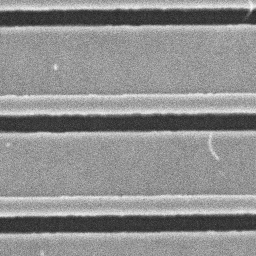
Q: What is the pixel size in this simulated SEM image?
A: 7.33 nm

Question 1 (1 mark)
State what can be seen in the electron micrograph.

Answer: lines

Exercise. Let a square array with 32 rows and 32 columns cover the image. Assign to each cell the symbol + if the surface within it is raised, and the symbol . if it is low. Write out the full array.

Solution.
++++++++++++++++++++++++++++++++
................................
................................
++++++++++++++++++++++++++++++++
++++++++++++++++++++++++++++++++
++++++++++++++++++++++++++++++++
++++++++++++++++++++++++++++++++
++++++++++++++++++++++++++++++++
++++++++++++++++++++++++++++++++
++++++++++++++++++++++++++++++++
++++++++++++++++++++++++++++++++
++++++++++++++++++++++++++++++++
++++++++++++++++++++++++++++++++
++++++++++++++++++++++++++++++++
................................
................................
..................++++++++++++++
++++++++++++++++++++++++++++++++
++++++++++++++++++++++++++++++++
++++++++++++++++++++++++++++++++
++++++++++++++++++++++++++++++++
++++++++++++++++++++++++++++++++
++++++++++++++++++++++++++++++++
++++++++++++++++++++++++++++++++
++++++++++++++++++++++++++++++++
++++++++++++++++++++++++++++++++
++++++++++++++++++++++++++++++++
................................
................................
++++++++++++++++++++++++++++++++
++++++++++++++++++++++++++++++++
++++++++++++++++++++++++++++++++